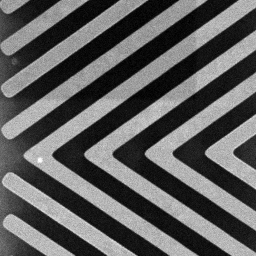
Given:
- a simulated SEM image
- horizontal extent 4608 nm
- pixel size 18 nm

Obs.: groups of lines, slits or small figures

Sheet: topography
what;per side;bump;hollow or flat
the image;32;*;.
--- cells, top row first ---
***....***....****....***....***
......***....***....****....***.
....****....***....***....****..
...***....****....***....***....
.****....***....****....***....*
***....****....***....****....**
**....***....****....***....****
.....***....***....****....***..
...****....***....***....****...
..***....****....***....***....*
****....***....****....***....**
**....****....***....****....***
.....***....****....***....****.
....***....***....****....***...
..****....***....***....****....
.***....****...****....***....**
***....***....****....***....***
.....****....***....****...****.
....***....****....***....****..
...****....***....****....***...
....****....***.....***....****.
......***....****....****....***
***....****....***.....***....**
.***.....***....****....****....
..****....****....***.....***...
....***.....***....****....****.
.....****....****....***.....***
.**....***.....***....****....**
.***....****....****....***.....
..****....***.....***....****...
....***....****....****....***..
.....****....***.....***....****